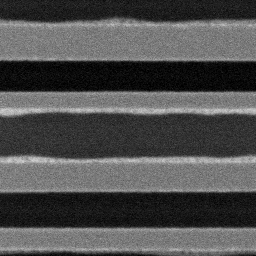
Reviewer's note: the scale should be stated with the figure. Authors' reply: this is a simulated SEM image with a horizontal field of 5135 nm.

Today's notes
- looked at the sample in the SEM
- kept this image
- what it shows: lines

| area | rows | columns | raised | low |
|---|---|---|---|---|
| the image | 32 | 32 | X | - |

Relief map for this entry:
--------------------------------
--------------------------------
--------------------------------
XXXXXXXXXXXXXXXXXXXXXXXXXXXXXXXX
XXXXXXXXXXXXXXXXXXXXXXXXXXXXXXXX
XXXXXXXXXXXXXXXXXXXXXXXXXXXXXXXX
XXXXXXXXXXXXXXXXXXXXXXXXXXXXXXXX
XXXXXXXXXXXXXXXXXXXXXXXXXXXXXXXX
--------------------------------
--------------------------------
--------------------------------
--------------------------------
XXXXXXXXXXXXXXXXXXXXXXXXXXXXXXXX
XXXXXXXXXXXXXXXXXXXXXXXXXXXXXXXX
--------------------------------
--------------------------------
--------------------------------
--------------------------------
--------------------------------
--------------------------------
XXXXXXXXXXXXXXXXXXXXXXXXXXXXXXXX
XXXXXXXXXXXXXXXXXXXXXXXXXXXXXXXX
XXXXXXXXXXXXXXXXXXXXXXXXXXXXXXXX
XXXXXXXXXXXXXXXXXXXXXXXXXXXXXXXX
--------------------------------
--------------------------------
--------------------------------
--------------------------------
--------------------------------
XXXXXXXXXXXXXXXXXXXXXXXXXXXXXXXX
XXXXXXXXXXXXXXXXXXXXXXXXXXXXXXXX
--------------------------------